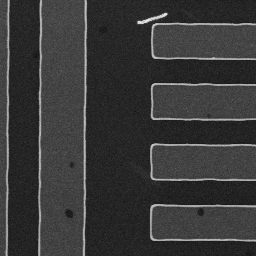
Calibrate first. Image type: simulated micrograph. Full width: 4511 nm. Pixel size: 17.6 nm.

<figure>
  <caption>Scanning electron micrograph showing groups of lines, slits or small figures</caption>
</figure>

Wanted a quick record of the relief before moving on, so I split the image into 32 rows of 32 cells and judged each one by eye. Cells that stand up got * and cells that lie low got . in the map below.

*....******.....................
*....******.....................
*....******.....................
*....******........*************
*....******........*************
*....******........*************
*....******........*************
*....******.....................
*....******.....................
*....******.....................
*....******.....................
*....******........*************
*....******........*************
*....******........*************
*....******........*************
*....******.....................
*....******.....................
*....******.....................
*....******........*************
*....******........*************
*....******........*************
*....******........*************
*....******.....................
*....******.....................
*....******.....................
*....******.....................
*....******........*************
*....******........*************
*....******........*************
*....******........*************
*....******.....................
*....******.....................